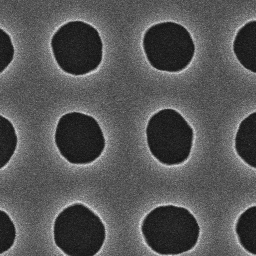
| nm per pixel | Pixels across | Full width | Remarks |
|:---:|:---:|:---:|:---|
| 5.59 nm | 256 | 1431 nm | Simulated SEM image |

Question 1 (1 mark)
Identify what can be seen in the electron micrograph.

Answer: holes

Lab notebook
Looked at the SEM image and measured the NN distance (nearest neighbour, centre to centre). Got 0.505 micrometres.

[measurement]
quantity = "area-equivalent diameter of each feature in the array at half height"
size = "51.4 px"